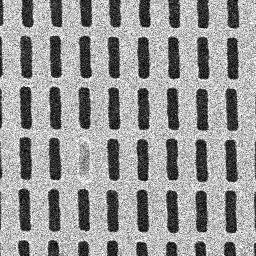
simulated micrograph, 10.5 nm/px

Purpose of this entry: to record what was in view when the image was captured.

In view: a regular array of holes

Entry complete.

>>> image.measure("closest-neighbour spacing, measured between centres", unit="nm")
310